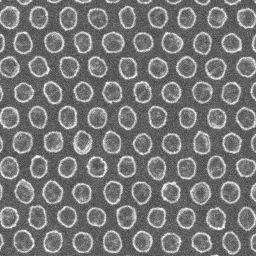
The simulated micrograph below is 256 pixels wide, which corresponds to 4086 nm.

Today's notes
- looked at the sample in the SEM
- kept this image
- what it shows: a regular array of raised bodies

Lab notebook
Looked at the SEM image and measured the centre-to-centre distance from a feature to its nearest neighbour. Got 28.4 pixels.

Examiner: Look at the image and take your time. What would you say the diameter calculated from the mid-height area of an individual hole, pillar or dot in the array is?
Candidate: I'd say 19.2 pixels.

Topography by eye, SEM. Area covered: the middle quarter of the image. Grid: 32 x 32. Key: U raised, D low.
UUUUDDUUUUDDDDUUUUDDDUUUUUDDUUUU
UUUUDDUUUUUDDDUUUUDDDUUUUUDDUUUU
UUUDDDDUUUDDDDUUUUDDDDUUUUDDDUUU
DDDDDDDDDDDDDDDUUDDDDDDUDDDDDDDD
DDDDDDDDDDDDDDDDDDDUDDDDDDDDDDDD
DDDUUUDDDDUUUUDDDDUUUDDDDUUUUDDD
DDDUUUUDDDUUUUDDDDUUUUDDDUUUUDDD
DDDUUUUDDDUUUUDDDDUUUUDDDUUUUDDD
DDDUUUUDDDUUUUDDDDUUUUDDDUUUUDDD
DDDDDDDDDDDUDDDDDDDUDDDDDDUUDDDD
DDDDDDDDDDDDDDDDDDDDDDDDDDDDDDDD
UUUDDDDUUUDDDDUUUDDDDUUUUDDDDUUU
UUUDDDUUUUDDDDUUUUDDDUUUUDDDDUUU
UUUDDDUUUUDDDDUUUUDDDDUUUDDDDUUU
UUUDDDUUUUDDDDUUUUDDDDUUUDDDDUUU
UUDDDDDUUUDDDDUUUDDDDDUUDDDDDDUU
DDDDDDDDDDDDDDDDDDDDDDDDDDDDDDDD
DDDUUUDDDDDUUDDDDDDDDDDDDDDDDDDD
DDDUUUUDDDUUUUDDDDUUUUDDDUUUUDDD
DDDDUUUDDDUUUUDDDDUUUUDDDUUUUDDD
DDDDDDUDDDUUUUDDDDUUUUDDDUUUUDDD
DDDUDUDDDDUUUUDDDDUUUDDDDUUUUDDD
DDDDDDDDDDDDDDDDDDDDDDDDDDDDDDDD
DDDDDDDUUDDDDDDUUDDDDDUUDDDDDDDD
UUUDDDUUUUDDDDUUUDDDDUUUUDDDDUUU
UUUDDDUUUUDDDDUUUUDDDUUUUDDDUUUU
UUUDDDUUUUDDDDUUUUDDDUUUUDDDUUUU
UUDDDDDUUUDDDDUUUDDDDDUUUDDDDUUU
DDDDDDDDDDDDDDDDDDDDDDDUDDDDDDUU
DDDDDDDDDDDDUDDDDDDDDDDDDDDDDDDD
DDDUUUDDDDDUUUDDDDUUUDDDDUUUDDDD
DDUUUUUDDDUUUUUDDUUUUDDDDUUUUDDD